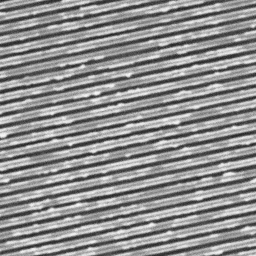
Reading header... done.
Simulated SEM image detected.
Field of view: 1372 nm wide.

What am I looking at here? parallel lines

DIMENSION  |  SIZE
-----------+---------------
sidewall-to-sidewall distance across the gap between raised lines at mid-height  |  30.2 nm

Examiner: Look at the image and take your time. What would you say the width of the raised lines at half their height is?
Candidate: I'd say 30.9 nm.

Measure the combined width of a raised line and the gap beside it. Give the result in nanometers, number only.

60.5